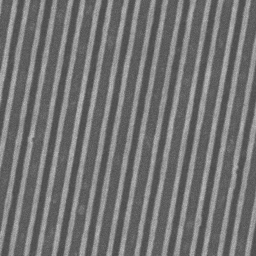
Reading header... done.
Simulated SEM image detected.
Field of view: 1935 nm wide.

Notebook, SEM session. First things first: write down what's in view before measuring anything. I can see parallel lines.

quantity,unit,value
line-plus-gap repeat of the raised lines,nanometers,103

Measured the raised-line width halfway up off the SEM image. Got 36.3 nanometres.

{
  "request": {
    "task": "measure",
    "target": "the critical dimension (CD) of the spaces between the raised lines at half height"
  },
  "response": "59.6 nm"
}